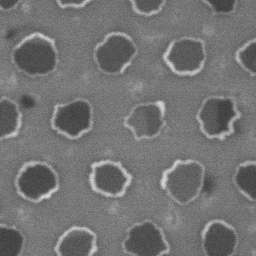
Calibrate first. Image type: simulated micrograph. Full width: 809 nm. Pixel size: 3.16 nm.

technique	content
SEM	a regular array of raised bodies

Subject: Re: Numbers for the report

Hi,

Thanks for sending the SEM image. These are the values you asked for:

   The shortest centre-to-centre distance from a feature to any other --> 223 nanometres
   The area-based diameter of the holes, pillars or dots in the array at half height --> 40.9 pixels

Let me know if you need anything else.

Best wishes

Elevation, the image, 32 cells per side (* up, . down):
**.....****......***......***...
.................***.......**...
................................
................................
....*........***................
..*****.....*****....****......*
..*****.....*****....*****....**
..*****.....****.....*****....**
..*****.....****.....****......*
................................
................................
................................
*........**...............***...
**.....****......****....*****..
***....*****....****.....*****..
***...******....*****....****...
**.....****......***.....****...
................................
................................
................................
...***......***.......***.....**
..*****....*****.....****.....**
..*****....*****....*****....***
..*****.....****.....****.....**
...***........*......****......*
................................
................................
................................
**.......*......****......***...
***.....****....****.....*****..
***....*****...******....*****..
***....*****....*****.....***...